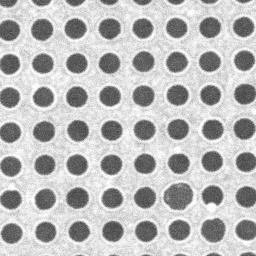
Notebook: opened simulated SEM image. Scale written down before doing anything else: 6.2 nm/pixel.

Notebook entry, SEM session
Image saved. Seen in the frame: a regular array of holes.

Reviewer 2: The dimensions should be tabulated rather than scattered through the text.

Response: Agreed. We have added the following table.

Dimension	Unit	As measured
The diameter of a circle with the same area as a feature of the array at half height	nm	143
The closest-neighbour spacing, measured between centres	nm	206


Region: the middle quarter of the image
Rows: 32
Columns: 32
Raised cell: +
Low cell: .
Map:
......+++.....+++......++......+
+.....+++.....++++....++++.....+
+++.++++++...++++++++++++++..+++
++++++++++++++++++++++++++++++++
++++++++++++++++++++++++++++++++
++..++++++...+++++....+++++...++
+.....+++.....+++......+++.....+
......+++.....+++......++.......
......++.......++......++......+
......+++.....+++.....++++.....+
+....+++++...+++++...++++++...++
++++++++++++++++++++++++++++++++
++++++++++++++++++++++++++++++++
++++++++++++++++++++++++++++.+++
+....+++++....++++....++++.....+
+.....+++......++......+++.....+
+......++......++......+++......
+.....+++......++......+++.....+
+.....++++....++++....+++++....+
+++.+++++++..+++++++++++++++++++
++++++++++++++++++++++++++++++++
++++++++++++++++++++++++++++++++
++...++++++..++++++...+++++...++
+.....++++....++++.....+++.....+
......+++......++......+++......
......+++......++......+++......
+.....+++.....++++.....+++.....+
+....+++++....+++++..++++++...++
++++++++++++++++++++++++++++++++
+++++++++++++++++++++++++++++.++
++++++++++++++++++++.+++++.....+
+.....++++....++++.....++.......